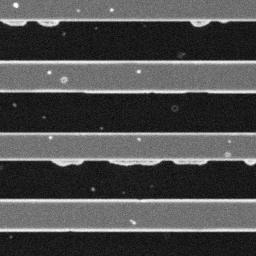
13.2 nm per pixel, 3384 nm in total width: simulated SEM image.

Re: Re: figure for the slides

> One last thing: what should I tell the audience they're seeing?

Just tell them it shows lines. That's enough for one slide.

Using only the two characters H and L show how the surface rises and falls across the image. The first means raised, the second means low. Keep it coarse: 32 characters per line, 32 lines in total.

HHHHHHHHHHHHHHHHHHHHHHHHHHHHHHHH
HHHHHHHHHHHHHHHHHHHHHHHHHHHHHHHH
HHHHHHHHHHHHHHHHHHHHHHHHHHHHHHHH
LLLLLLLLLLLLLLLLLLLLLLLLLLLLLLLL
LLLLLLLLLLLLLLLLLLLLLLLLLLLLLLLL
LLLLLLLLLLLLLLLLLLLLLLLLLLLLLLLL
LLLLLLLLLLLLLLLLLLLLLLLLLLLLLLLL
LLLLLLLLLLLLLLLLLLLLLLLLLLLLLLLL
HHHHHHHHHHHHHHHHHHHHHHHHHHHHHHHH
HHHHHHHHHHHHHHHHHHHHHHHHHHHHHHHH
HHHHHHHHHHHHHHHHHHHHHHHHHHHHHHHH
LLLLLLLLLLHHHHHHHHLHHHHLLLHHHHHH
LLLLLLLLLLLLLLLLLLLLLLLLLLLLLLLL
LLLLLLLLLLLLLLLLLLLLLLLLLLLLLLLL
LLLLLLLLLLLLLLLLLLLLLLLLLLLLLLLL
LLLLLLLLLLLLLLLLLLLLLLLLLLLLLLLL
LLLLLLLLLLLLLLLLLLLLLLLLLLLLLLLL
HHHHHHHHHHHHHHHHHHHHHHHHHHHHHHHH
HHHHHHHHHHHHHHHHHHHHHHHHHHHHHHHH
HHHHHHHHHHHHHHHHHHHHHHHHHHHHHHHH
LLLLLLLLLLLLLLLLLLLLLLLLLLLLLLLL
LLLLLLLLLLLLLLLLLLLLLLLLLLLLLLLL
LLLLLLLLLLLLLLLLLLLLLLLLLLLLLLLL
LLLLLLLLLLLLLLLLLLLLLLLLLLLLLLLL
LLLLLLLLLLLLLLLLLLLLLLLLLLLLLLLL
HHHHHHHHHHHHHHHHHHHHHHHHHHHHHHHH
HHHHHHHHHHHHHHHHHHHHHHHHHHHHHHHH
HHHHHHHHHHHHHHHHHHHHHHHHHHHHHHHH
HHHHHHHHHHHHHHHHHHHHHHHHHHHHHHHH
LLLLLLLLLLLLLLLLLLLLLLLLLLLLLLLL
LLLLLLLLLLLLLLLLLLLLLLLLLLLLLLLL
LLLLLLLLLLLLLLLLLLLLLLLLLLLLLLLL